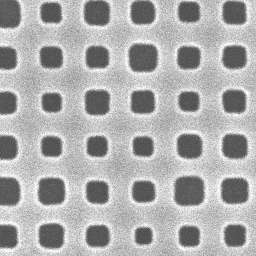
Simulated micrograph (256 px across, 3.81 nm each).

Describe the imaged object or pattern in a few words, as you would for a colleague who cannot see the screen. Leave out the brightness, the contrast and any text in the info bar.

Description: a regular array of holes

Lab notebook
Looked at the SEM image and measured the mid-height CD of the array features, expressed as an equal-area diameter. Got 94.9 nm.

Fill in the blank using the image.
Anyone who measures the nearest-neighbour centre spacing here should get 169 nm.